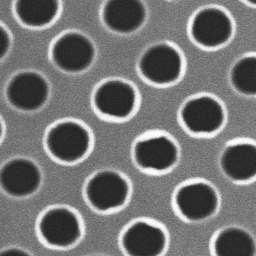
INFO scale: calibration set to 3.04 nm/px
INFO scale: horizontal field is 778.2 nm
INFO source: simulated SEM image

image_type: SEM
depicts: a regular array of holes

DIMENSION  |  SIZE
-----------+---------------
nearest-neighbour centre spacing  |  0.182 microns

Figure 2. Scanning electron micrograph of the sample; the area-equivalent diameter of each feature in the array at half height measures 113 nm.